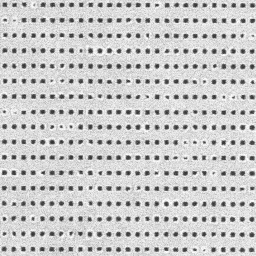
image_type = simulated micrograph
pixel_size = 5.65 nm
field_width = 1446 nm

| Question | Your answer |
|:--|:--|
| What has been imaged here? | a regular array of holes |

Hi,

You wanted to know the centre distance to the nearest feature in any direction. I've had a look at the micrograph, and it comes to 52.7 nanometers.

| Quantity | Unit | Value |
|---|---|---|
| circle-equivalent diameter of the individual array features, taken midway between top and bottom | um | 0.0285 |